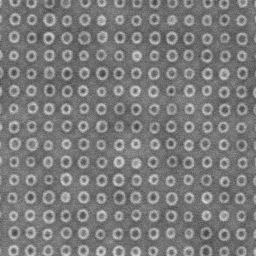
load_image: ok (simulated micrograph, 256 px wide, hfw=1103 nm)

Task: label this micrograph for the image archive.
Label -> a regular array of raised bodies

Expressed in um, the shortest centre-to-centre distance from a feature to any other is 0.0731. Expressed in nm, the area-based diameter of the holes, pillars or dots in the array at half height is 39.5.